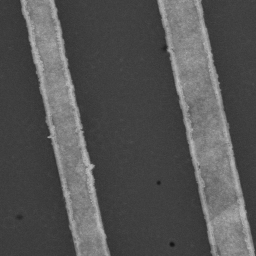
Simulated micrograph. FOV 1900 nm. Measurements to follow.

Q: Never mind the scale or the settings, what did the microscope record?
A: one or a few lines or trenches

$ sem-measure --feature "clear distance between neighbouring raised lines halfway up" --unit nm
788